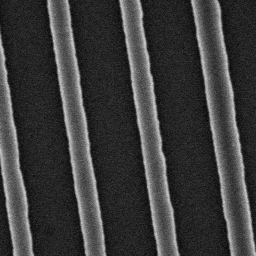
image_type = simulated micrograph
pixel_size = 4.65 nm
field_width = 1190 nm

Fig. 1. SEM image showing lines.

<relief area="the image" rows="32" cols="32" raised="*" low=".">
......***......***......***.....
......***......***......****....
......***......***......****....
......***.......**.......***....
.......**.......**.......***....
.......**.......**.......***....
.......**.......**.......***....
*......***......***......***....
*......***......***......***....
*......***......***.......***...
*......***.......**.......***...
*.......**.......**.......***...
*.......**.......**.......***...
*.......**.......**.......***...
**......***......***......***...
**......***......***......***...
**......***......***.......***..
**.......**.......**.......***..
**.......**.......**.......***..
**.......**.......**.......***..
**.......**.......***......***..
***......***......***......***..
***......***......***.......***.
***......***......***.......***.
.**.......**.......**.......***.
.**.......**.......**.......***.
.**.......**.......***......***.
.***......***......***......***.
.***......***......***......***.
.***......***......***.......***
..**.......**.......**.......***
..**.......**.......**.......***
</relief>